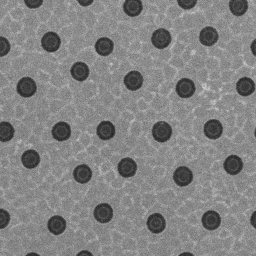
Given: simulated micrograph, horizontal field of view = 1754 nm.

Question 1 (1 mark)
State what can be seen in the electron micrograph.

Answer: a regular array of ring-shaped grooves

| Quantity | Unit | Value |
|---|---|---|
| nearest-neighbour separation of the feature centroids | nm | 304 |